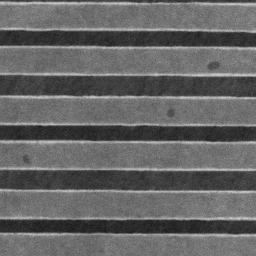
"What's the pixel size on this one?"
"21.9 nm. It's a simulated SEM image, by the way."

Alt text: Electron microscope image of lines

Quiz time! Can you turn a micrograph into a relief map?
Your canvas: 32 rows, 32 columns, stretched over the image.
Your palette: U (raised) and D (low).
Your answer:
UUUUUUUUUUUUUUUUUUUUUUUUUUUUUUUU
UUUUUUUUUUUUUUUUUUUUUUUUUUUUUUUU
UUUUUUUUUUUUUUUUUUUUUUUUUUUUUUUU
UUUUUUUUUUUUUUUUUUUUUUUUUUUUUUUU
DDDDDDDDDDDDDDDDDDDDDDDDDDDDDDDD
DDDDDDDDDDDDDDDDDDDDDDDDDDDDDDDD
UUUUUUUUUUUUUUUUUUUUUUUUUUUUUUUU
UUUUUUUUUUUUUUUUUUUUUUUUUUUUUUUU
UUUUUUUUUUUUUUUUUUUUUUUUUUUUUUUU
DDDDDDDDDDDDDDDDDDDDDDDDDDDDDDDD
DDDDDDDDDDDDDDDDDDDDDDDDDDDDDDDD
DDDDDDDDDDDDDDDDDDDDDDDDDDDDDDDD
UUUUUUUUUUUUUUUUUUUUUUUUUUUUUUUU
UUUUUUUUUUUUUUUUUUUUUUUUUUUUUUUU
UUUUUUUUUUUUUUUUUUUUUUUUUUUUUUUU
UUUUUUUUUUUUUUUUUUUUUUUUUUUUUUUU
DDDDDDDDDDDDDDDDDDDDDDDDDDDDDDDD
DDDDDDDDDDDDDDDDDDDDDDDDDDDDDDDD
UUUUUUUUUUUUUUUUUUUUUUUUUUUUUUUU
UUUUUUUUUUUUUUUUUUUUUUUUUUUUUUUU
UUUUUUUUUUUUUUUUUUUUUUUUUUUUUUUU
DDDDDDDDDDDDDDDDDDDDDDDDDDDDDDDD
DDDDDDDDDDDDDDDDDDDDDDDDDDDDDDDD
DDDDDDDDDDDDDDDDDDDDDDDDDDDDDDDD
UUUUUUUUUUUUUUUUUUUUUUUUUUUUUUUU
UUUUUUUUUUUUUUUUUUUUUUUUUUUUUUUU
UUUUUUUUUUUUUUUUUUUUUUUUUUUUUUUU
DDDDDDDDDDDDDDDDDDDDDDDDDDDDDDDD
DDDDDDDDDDDDDDDDDDDDDDDDDDDDDDDD
UUUUUUUUUUUUUUUUUUUUUUUUUUUUUUUU
UUUUUUUUUUUUUUUUUUUUUUUUUUUUUUUU
UUUUUUUUUUUUUUUUUUUUUUUUUUUUUUUU